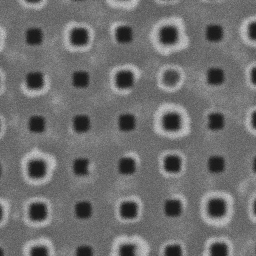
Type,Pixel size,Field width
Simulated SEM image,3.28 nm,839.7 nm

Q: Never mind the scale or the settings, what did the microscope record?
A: a regular array of holes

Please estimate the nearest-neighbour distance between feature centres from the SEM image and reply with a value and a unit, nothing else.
0.141 micrometres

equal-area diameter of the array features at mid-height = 0.0574 micrometres